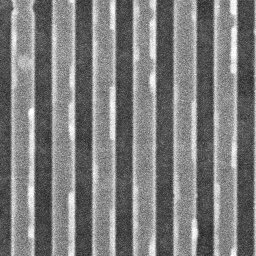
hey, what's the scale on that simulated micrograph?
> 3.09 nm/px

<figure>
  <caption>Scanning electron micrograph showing parallel lines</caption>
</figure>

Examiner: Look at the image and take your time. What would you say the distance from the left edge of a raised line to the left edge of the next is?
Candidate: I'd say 40.6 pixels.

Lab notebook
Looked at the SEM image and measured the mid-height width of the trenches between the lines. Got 58 nm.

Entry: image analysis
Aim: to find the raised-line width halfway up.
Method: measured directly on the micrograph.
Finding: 66.9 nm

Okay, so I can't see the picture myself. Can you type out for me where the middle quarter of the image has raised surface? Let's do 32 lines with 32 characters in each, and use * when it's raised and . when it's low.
**......****......*****.....****
**......****......*****.....****
**......*****.....*****.....****
**......*****.....*****.....****
**......*****.....*****.....****
**......*****.....*****.....****
**......*****.....*****.....****
**......*****.....*****.....****
**......*****.....*****.....****
**......*****.....*****.....****
**......*****.....*****.....****
**......*****.....*****.....****
**......*****.....*****.....****
**......*****.....*****.....****
**......*****.....*****.....****
**......*****.....*****.....****
**......*****.....*****.....****
**......*****.....*****.....****
**......*****.....*****.....****
**......*****.....*****.....****
**......****......*****.....****
**......****......*****.....****
**......****......*****.....****
**......*****.....*****.....****
**......*****.....*****.....****
**......*****.....*****.....****
**......*****.....*****.....****
**......*****.....*****.....****
**......*****.....*****.....****
**......*****.....*****.....****
**......*****.....*****.....****
**.....*****......*****.....****